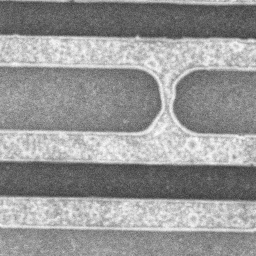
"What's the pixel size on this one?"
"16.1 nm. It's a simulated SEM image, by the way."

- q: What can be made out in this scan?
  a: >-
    one or a few lines or trenches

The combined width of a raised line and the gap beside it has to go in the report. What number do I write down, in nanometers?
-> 1300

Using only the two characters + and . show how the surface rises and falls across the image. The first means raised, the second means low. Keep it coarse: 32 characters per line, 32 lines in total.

................................
................................
................................
................................
+++.............................
++++++++++++++++++++++++++++++++
++++++++++++++++++++++++++++++++
++++++++++++++++++++++++++++++++
.................++++++++++..+++
...................++++.........
....................++..........
....................++..........
....................++..........
....................+...........
....................++..........
...................+++..........
++++..............++++++........
++++++++++++++++++++++++++++++++
++++++++++++++++++++++++++++++++
++++++++++++++++++++++++++++++++
.........................++++++.
................................
................................
................................
................................
++++++++++++++++++++++++++++++++
++++++++++++++++++++++++++++++++
++++++++++++++++++++++++++++++++
.............+++++++++++++++++++
................................
................................
................................